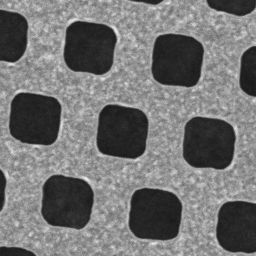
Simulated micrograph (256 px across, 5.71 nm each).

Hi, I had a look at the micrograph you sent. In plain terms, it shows holes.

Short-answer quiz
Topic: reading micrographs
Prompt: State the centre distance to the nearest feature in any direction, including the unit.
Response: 506 nanometres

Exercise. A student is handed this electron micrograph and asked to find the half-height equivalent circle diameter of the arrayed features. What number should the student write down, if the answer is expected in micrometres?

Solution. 0.315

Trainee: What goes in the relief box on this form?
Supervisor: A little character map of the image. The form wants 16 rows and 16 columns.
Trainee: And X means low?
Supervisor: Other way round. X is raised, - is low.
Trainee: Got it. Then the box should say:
XXXXXXXXXXXXX---
--XXX-XXXXXXXXXX
--XX---XXX--XXXX
-XXX---XXX---XX-
XXXXX--XXX---XX-
XXXXXXXXXXXXXXX-
X---XXXXXXXXXXXX
X---XX---XXX--XX
X---XX---XX----X
XXXXXX---XX----X
XXXXXXXXXXXXX-XX
XXX---XXXXXXXXXX
XXX---XX---XXXXX
XXX---XX---XXX--
XXXXXXXX---XXX--
-XXXXXXXXXXXXX--